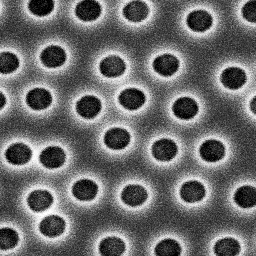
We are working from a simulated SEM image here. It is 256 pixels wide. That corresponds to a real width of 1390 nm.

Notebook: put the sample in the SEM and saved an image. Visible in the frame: a regular array of holes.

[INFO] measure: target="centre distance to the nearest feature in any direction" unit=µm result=0.242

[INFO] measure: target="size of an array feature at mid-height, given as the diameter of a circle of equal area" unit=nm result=141